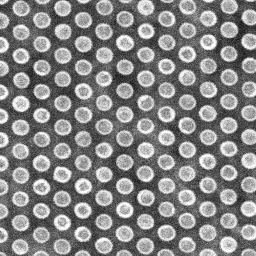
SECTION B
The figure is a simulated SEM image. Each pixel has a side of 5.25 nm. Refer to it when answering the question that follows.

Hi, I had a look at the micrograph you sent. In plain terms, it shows a regular array of raised bodies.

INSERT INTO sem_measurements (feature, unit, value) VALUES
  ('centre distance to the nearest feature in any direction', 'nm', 124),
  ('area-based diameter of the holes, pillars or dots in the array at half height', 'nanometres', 78.4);